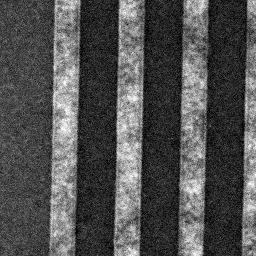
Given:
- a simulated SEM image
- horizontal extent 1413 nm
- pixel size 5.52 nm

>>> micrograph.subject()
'one or a few lines or trenches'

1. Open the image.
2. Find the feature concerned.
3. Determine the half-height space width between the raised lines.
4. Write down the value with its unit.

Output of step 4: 0.218 microns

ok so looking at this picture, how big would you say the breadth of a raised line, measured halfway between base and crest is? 0.131 µm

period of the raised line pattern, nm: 354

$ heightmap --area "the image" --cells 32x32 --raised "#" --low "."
.......###.....###.....###.....#
.......###.....###.....###.....#
.......###.....###.....###.....#
.......###.....###.....###.....#
.......###.....###.....###.....#
.......###.....###.....###.....#
.......###.....###.....###.....#
.......###.....###.....###.....#
.......###.....###.....###.....#
.......###.....###.....###.....#
.......###.....###.....###.....#
.......###.....###.....###.....#
.......###.....###.....###.....#
.......###.....###.....###.....#
.......###.....###.....###.....#
.......###.....###.....###.....#
.......###.....###.....###.....#
.......###.....###.....###.....#
.......##......###.....###.....#
.......##......###.....###.....#
.......##......###.....###.....#
.......##......###.....###.....#
.......##......###.....##......#
.......##......###....###......#
.......##......###.....##.....##
......###......###.....##.....##
......###......##......##.....##
......###.....###......##.....##
......###.....###.....###.....##
......###.....###.....###.....##
......###.....###.....###.....##
......###.....###.....###.....##